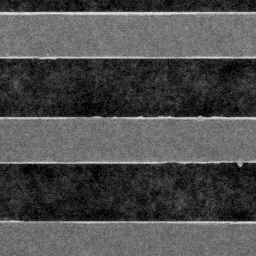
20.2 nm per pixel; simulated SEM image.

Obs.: lines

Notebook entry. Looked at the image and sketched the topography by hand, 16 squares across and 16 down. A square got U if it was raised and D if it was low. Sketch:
DDDDDDDDDDDDDDDD
UUUUUUUUUUUUUUUU
UUUUUUUUUUUUUUUU
UUUUUUUUUUUUUUUU
DDDDDDDDDDDDDDDD
DDDDDDDDDDDDDDDD
DDDDDDDDDDDDDDDD
UUUUUUUUUUUUUUUU
UUUUUUUUUUUUUUUU
UUUUUUUUUUUUUUUU
DDDDDDDDDDDDDDDD
DDDDDDDDDDDDDDDD
DDDDDDDDDDDDDDDD
DDDDDDDDDDDDDDDD
UUUUUUUUUUUUUUUU
UUUUUUUUUUUUUUUU